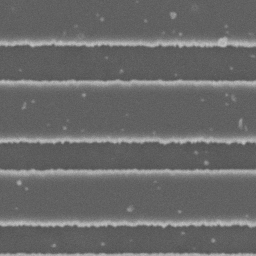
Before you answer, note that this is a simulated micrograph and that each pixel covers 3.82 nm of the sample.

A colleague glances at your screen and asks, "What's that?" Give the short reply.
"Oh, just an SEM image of lines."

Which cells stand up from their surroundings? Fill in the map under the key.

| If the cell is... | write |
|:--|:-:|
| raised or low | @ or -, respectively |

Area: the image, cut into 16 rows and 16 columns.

@@@@@@@@@@@@@@@@
@@@@@@@@@@@@@@@@
@@@@@@@@@@@@@@@@
----------------
----------------
@@@@@@@@@@@@@@@@
@@@@@@@@@@@@@@@@
@@@@@@@@@@@@@@@@
@@@@@@@@@@@@@@@@
----------------
----------------
@@@@@@@@@@@@@@@@
@@@@@@@@@@@@@@@@
@@@@@@@@@@@@@@@@
----------------
----------------